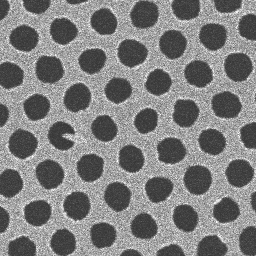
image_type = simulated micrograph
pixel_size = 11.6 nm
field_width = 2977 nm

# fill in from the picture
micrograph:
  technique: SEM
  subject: a regular array of holes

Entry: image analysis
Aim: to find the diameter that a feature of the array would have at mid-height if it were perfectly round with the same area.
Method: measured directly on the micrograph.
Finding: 326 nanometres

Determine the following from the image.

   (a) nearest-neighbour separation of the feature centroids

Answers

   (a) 460 nm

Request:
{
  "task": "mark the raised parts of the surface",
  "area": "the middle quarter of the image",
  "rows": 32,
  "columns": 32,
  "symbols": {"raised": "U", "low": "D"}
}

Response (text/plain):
UUUUDDDDDDUUUUUDDDUUUUUUUUUUUUDD
UUUUDDDDDUUUUUUUUUUUUUUDDUUUUUDD
UUUUUUDUUUUUUUUUUUUUUDDDDDUUUUDD
UUUUUUUUUUUUDDUUUUUUUDDDDDDUUUDD
UUUUUUUUUUUDDDDDUUUUDDDDDDDUUUUD
UUDDDDUUUUDDDDDDDUUUDDDDDDDUUUUU
UDDDDDUUUUDDDDDDDUUUUDDDDDUUUUUU
DDDDDDDUUUDDDDDDDUUUUUDDDUUUUUUU
DDDDDDDUUUUDDDDDUUUUUUUUUUUUUUUU
DDDDDDDUUUUUDDDUUUUUUUUUUUUUDDDD
DDDDDDUUUUUUUUUUUUUUUUUUUUUDDDDD
UDDDDUUUUUUUUUUUUUUDDDDUUUUDDDDD
UUUUUUUUUUUUUUUUUUDDDDDUUUUDDDDD
UUUUUUUUDDDDUUUUUUDDDDDUUUUDDDDD
UUUUUUUDDDDDDUUUUDDDDDDUUUUUDDDD
DDUUUUUDDDDDDUUUUUDDDDDUUUUUUDDD
DDDUUUUDDDDDDDUUUUDDDDDUUUUUUUUU
DDDUUUUDDDDDDUUUUUUDDUUUUUUUUUUU
UUUUUUUUDDDDDUUUUUUUUUUUUDDDUUUU
DDDUUUUUUUDUUUUUUUUUUUUUDDDDDUUU
DDUUUUUUUUUUUUUDDDUUUUUDDDDDDDUU
DUUUUUUUUUUUUUDDDDDUUUUDDDDDDDDU
UUUUUUDDUUUUUUDDDDDDUUUDDDDDDDDU
UUUUDDDDDDUUUUDDDDDDUUUUDDDDDDUU
UUUDDDDDDDUUUUDDDDDDUUUUDDDDDUUU
UUUDDDDDDDUUUUDDDDDDUUUUUUUUUUUU
UUUDDDDDDDUUUUUDDDDUUUUUUUUUUUUD
UUUDDDDDDDUUUUUUUUUUUUUUUUUUUUDD
UUUUDDDDDUUUUUUUUUUUUUDDDUUUUUDD
UUUUUDDUUUUUDDUUUUUUUDDDDDDUUUDD
UUUUUUUUUUUDDDDDUUUUDDDDDDDUUUDD
UUUUUUUUUUDDDDDDDUUUDDDDDDDUUUUD